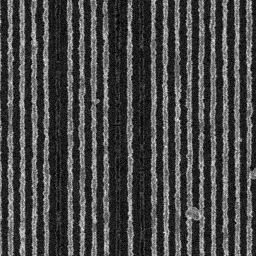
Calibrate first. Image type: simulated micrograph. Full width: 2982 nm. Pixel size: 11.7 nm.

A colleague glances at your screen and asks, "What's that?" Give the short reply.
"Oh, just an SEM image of parallel lines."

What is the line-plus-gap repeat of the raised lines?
139 nm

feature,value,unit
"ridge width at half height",51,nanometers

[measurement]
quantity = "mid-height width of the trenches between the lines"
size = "88.8 nm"